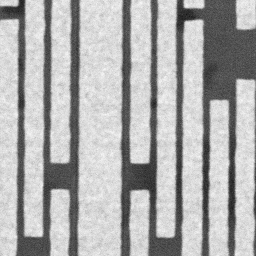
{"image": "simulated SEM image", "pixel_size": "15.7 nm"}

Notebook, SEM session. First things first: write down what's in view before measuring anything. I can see wiring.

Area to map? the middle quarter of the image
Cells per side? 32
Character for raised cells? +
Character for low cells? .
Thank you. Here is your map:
+...++++++++++...++++...++++..++
+...++++++++++...++++...++++..++
+...++++++++++...++++...++++..++
+...++++++++++...++++...++++..++
+...++++++++++...++++...++++..++
+...++++++++++...++++...++++..++
+...++++++++++...++++...++++..++
+...++++++++++...++++...++++..++
+...++++++++++...++++...++++..++
+...++++++++++...++++...++++..++
+...++++++++++...++++...++++..++
+...++++++++++...++++...++++..++
+...++++++++++...++++...++++..++
+...++++++++++...++++...++++..++
+...++++++++++...++++..+++++..++
+...++++++++++...++++..+++++..++
+...++++++++++...++++..+++++..++
+...++++++++++...++++..+++++..++
+...++++++++++...++++..+++++..++
+...++++++++++...++++...++++..++
+...++++++++++...++++...++++..++
+...++++++++++...++++...++++..++
+...++++++++++...++++...++++..++
+...++++++++++...++++...++++..++
+...++++++++++...+++....++++..++
....++++++++++..........++++..++
....++++++++++..........++++..++
....++++++++++..........++++..++
....++++++++++.........+++++..++
....++++++++++.........+++++..++
....++++++++++.........+++++..++
....++++++++++.........+++++..++